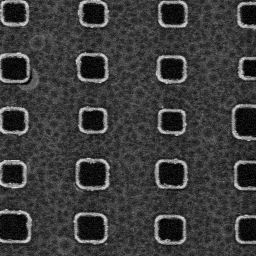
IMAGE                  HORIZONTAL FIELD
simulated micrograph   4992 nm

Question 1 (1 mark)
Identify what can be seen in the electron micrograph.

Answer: a regular array of raised bodies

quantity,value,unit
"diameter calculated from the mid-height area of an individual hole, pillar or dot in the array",558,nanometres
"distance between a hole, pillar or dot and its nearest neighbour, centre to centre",1.04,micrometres